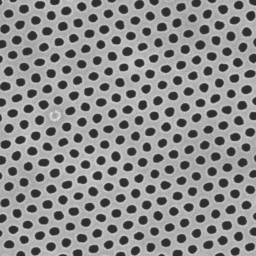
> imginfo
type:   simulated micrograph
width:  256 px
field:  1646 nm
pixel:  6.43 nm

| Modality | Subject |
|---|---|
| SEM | a regular array of holes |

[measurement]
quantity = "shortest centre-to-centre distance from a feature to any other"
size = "99.7 nm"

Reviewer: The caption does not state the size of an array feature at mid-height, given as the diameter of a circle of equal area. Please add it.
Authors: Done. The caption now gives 9.3 px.